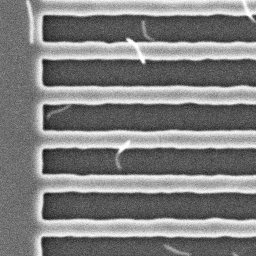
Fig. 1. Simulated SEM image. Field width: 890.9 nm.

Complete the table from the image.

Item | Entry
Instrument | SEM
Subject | groups of lines, slits or small figures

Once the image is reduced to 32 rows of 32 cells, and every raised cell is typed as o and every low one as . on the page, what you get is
oooooooooooooooooooooooooooooooo
oooooooooooooooooooooooooooooooo
ooooo...........................
ooooo...........................
ooooo...........................
oooooooooooooooooooooooooooooooo
oooooooooooooooooooooooooooooooo
oooooo...........o..............
ooooo...........................
ooooo...........................
ooooo...........................
oooooooooooooooooooooooooooooooo
oooooooooooooooooooooooooooooooo
ooooo...........................
ooooo...........................
ooooo...........................
ooooooo.o....ooo....oooo...ooooo
oooooooooooooooooooooooooooooooo
oooooo.........o................
ooooo...........................
ooooo...........................
ooooo...........................
oooooooooooooooooooooooooooooooo
oooooooooooooooooooooooooooooooo
ooooo...........................
ooooo...........................
ooooo...........................
oooooo...oo...ooo..ooo...ooo....
oooooooooooooooooooooooooooooooo
oooooooo.oooooooooo.oooooooooooo
ooooo...........................
ooooo...........................